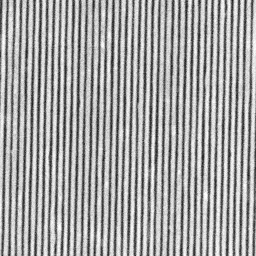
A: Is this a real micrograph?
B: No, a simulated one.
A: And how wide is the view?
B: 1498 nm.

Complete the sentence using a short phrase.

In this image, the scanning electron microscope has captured parallel lines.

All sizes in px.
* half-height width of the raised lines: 3.25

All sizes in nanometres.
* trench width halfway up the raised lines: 19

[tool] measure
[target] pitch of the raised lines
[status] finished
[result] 38.6 nanometres